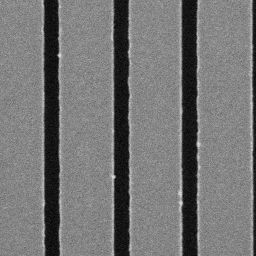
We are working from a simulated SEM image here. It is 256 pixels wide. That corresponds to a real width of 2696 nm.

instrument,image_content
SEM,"lines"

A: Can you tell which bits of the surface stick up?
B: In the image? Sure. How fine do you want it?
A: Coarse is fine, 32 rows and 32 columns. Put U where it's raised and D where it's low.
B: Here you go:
UUUUUDDUUUUUUUDDUUUUUUUDDUUUUUUD
UUUUUDDUUUUUUUDDUUUUUUUDDUUUUUUD
UUUUUDDUUUUUUUDDUUUUUUUDDUUUUUUD
UUUUUDDUUUUUUUDDUUUUUUUDDUUUUUUD
UUUUUDDUUUUUUUDDUUUUUUUDDUUUUUUD
UUUUUDDUUUUUUUDDUUUUUUUDDUUUUUUD
UUUUUDDUUUUUUUDDUUUUUUUDDUUUUUUD
UUUUUDDUUUUUUUDDUUUUUUUDDUUUUUUD
UUUUUDDUUUUUUUDDUUUUUUUDDUUUUUUD
UUUUUDDUUUUUUUDDUUUUUUUDDUUUUUUD
UUUUUDDUUUUUUUDDUUUUUUUDDUUUUUUD
UUUUUDDUUUUUUUDDUUUUUUUDDUUUUUUD
UUUUUDDUUUUUUUDDUUUUUUUDDUUUUUUD
UUUUUDDUUUUUUUDDUUUUUUUDDUUUUUUD
UUUUUDDUUUUUUUDDUUUUUUUDDUUUUUUD
UUUUUDDUUUUUUUDDUUUUUUUDDUUUUUUD
UUUUUDDUUUUUUUDDUUUUUUUDDUUUUUUD
UUUUUDDUUUUUUUDDUUUUUUUDDUUUUUUU
UUUUUDDUUUUUUUDDUUUUUUUDDUUUUUUU
UUUUUDDUUUUUUUDDUUUUUUUDDUUUUUUD
UUUUUDDDUUUUUUDDUUUUUUUDDUUUUUUD
UUUUUDDUUUUUUUDDUUUUUUUDDUUUUUUD
UUUUUDDUUUUUUUDDUUUUUUUDDUUUUUUD
UUUUUDDUUUUUUUDDUUUUUUUDDUUUUUUU
UUUUUDDUUUUUUUDDUUUUUUUDDUUUUUUU
UUUUUDDUUUUUUUDDUUUUUUUDDUUUUUUU
UUUUUDDDUUUUUUDDUUUUUUUDDUUUUUUU
UUUUUDDDUUUUUUDDUUUUUUUDDUUUUUUU
UUUUUDDUUUUUUUDDUUUUUUUDDUUUUUUU
UUUUUDDUUUUUUUDDUUUUUUUDDUUUUUUU
UUUUUUDUUUUUUUDDUUUUUUUDDUUUUUUU
UUUUUUDDUUUUUUDDUUUUUUUDDUUUUUUU